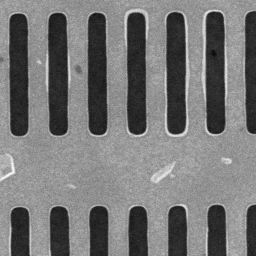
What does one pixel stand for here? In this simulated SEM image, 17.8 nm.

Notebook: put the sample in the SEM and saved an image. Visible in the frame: groups of lines, slits or small figures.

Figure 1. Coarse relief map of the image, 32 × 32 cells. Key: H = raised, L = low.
HHHHHHHHHHHHHHHHHHHHHHHHHHHHHHHH
HHHHHHHHHHHHHHHHLLHHHHHHHHLHHHHL
HLLHHHLLHHHLLHHHLLHHHLLHHHLLHHHL
HLLLHHLLHHHLLHHHLLHHHLLHHLLLHHLL
HLLLHHLLHHHLLHHHLLHHHLLHHLLLHHLL
HLLLHHLLLHHLLHHHLLHHHLLHHLLLHHLL
HLLLHHLLLHHLLHHHLLHHHLLHHLLLHHLL
HLLLHHLLLHHLLHHHLLHHHLLHHLLLHHLL
HLLLHHLLLHHLLHHHLLHHHLLHHLLLHHLL
HLLLHHLLLHHLLHHHLLHHHLLLHLLLHHLL
HLLLHHLLLHHLLHHHLLHHHLLHHLLLHHHL
HLLLHHLLLHHLLHHHLLHHHLLHHHLLHHHL
HLLLHHLLLHHLLHHHLLHHHLLHHHLLHHHL
HLLLHHLLLHHLLHHHLLHHHLLHHHLLHHHL
HLLLHHLLLHHLLHHHLLHHHLLHHHLLHHHL
HLLLHHLLLHHLLHHHLLHHHLLHHHLLHHHL
HLLHHHLLHHHLLHHHLLHHHLLHHHLLHHHL
HHHHHHHHHHHHHHHHHHHHHHHHHHHHHHHH
HHHHHHHHHHHHHHHHHHHHHHHHHHHHHHHH
HHHHHHHHHHHHHHHHHHHHHHHHHHHHHHHH
HHHHHHHHHHHHHHHHHHHHHHHHHHHHHHHH
HHHHHHHHHHHHHHHHHHHHHHHHHHHHHHHH
HHHHHHHHHHHHHHHHHHHHHHHHHHHHHHHH
HHHHHHHHHHHHHHHHHHHHHHHHHHHHHHHH
HHHHHHHHHHHHHHHHHHHHHHHHHHHHHHHH
HHHHHHHHHHHHHHHHHHHHHHHHHHHHHHHH
HLLLHHLLLHHLLHHHLLHHHLLHHHLLHHHL
HLLLHHLLLHHLLLHHLLLHHLLHHHLLHHHL
HLLLHHLLLHHLLLHHLLLHHLLHHHLLHHHL
HLLLHHLLLHHLLLHHLLLHHLLHHHLLHHHL
HLLLHHLLLHHLLLHHLLLHHLLHHHLLHHHL
HLLLHHLLLHHLLLHHLLLHHLLHHHLLHHHL